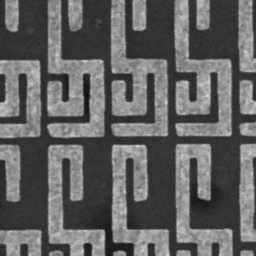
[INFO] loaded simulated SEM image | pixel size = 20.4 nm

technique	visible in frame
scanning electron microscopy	wiring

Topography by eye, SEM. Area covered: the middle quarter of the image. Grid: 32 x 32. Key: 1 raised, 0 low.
11111111110011111111111110001111
11111111110011111111111110001111
01111011110000000111101110000000
01111001110000000111000110000000
01111001110011100111000111000110
01111001110011100111000111001110
01111001110011100111000111001110
01111001110011100111000111001110
01111001110011100111000111001110
01111001110011110111000110001111
11111001110011111111000110001111
11111001110011111111000111001111
11111001110011111111000111000000
00000001110000000000000111000000
00000011110000000000000111000000
11111111110011111111111111001111
11111111110011111111111111001111
11111111110011111111111111001111
00000000000000000000000000000000
00000000000000000000000000000000
11110000000011111111000000001111
11111000000011111111000000001111
11111000000011111111000000001111
01110000000011110111000000001111
00110000000011100011000000001110
00110000000011100011000000001110
00110000000011100011000000001110
00110000000011100011000000001110
00110000000011100011100000001110
00111000000011100011100000001110
00111000000011100011100000001110
00111000000011100011100000001110